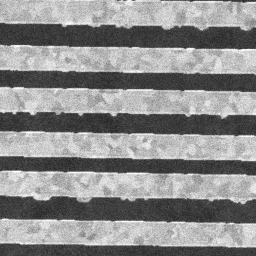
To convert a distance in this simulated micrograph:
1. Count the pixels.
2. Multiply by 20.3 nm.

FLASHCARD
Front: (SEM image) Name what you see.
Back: lines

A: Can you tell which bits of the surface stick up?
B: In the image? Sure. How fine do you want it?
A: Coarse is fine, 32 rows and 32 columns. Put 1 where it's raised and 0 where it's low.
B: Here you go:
11111111111111111111111111111111
11111111111111111111111111111111
11111111111111111111111111111111
00000000000000000000000000000000
00000000000000000000000000000000
00000000000000000000000000000000
11111111111111111111111111111111
11111111111111111111111111111111
11111111111111111111111111111111
00000000000000000000000000000000
00000000000000000000000000000000
11111111111111111111111111111000
11111111111111111111111111111111
11111111111111111111111111111111
00000000000000000000000000000000
00000000000000000000000000000000
11000000000000000000000000000000
11111111111111111111111111111111
11111111111111111111111111111111
00011111111111111111111111111111
00000000000000000000000000000000
00000000000000000000000000000000
11111111111111111111111111111111
11111111111111111111111111111111
00000000011111111111111111111111
00000000000000000000000000000000
00000000000000000000000000000000
00000000000000000000000000000000
11111111111111111111111111111111
11111111111111111111111111111111
00000000000011111111111111111111
00000000000000000000000000000000